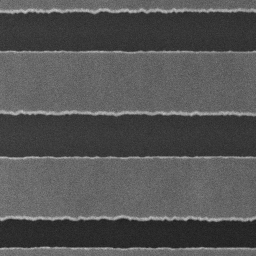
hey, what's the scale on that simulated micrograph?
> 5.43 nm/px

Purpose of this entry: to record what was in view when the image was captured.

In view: lines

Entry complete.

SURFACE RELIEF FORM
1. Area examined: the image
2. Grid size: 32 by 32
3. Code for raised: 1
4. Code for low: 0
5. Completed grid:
11111111111111111111111111111111
11111111000100101010110000000000
00000000000000000000000000000000
00000000000000000000000000000000
00000000000000000000000000000000
00000000000000000000000000000000
11111111111111110111111111101001
11111111111111111111111111111111
11111111111111111111111111111111
11111111111111111111111111111111
11111111111111111111111111111111
11111111111111111111111111111111
11111111111111111111111111111111
11111111111111111111111111111111
00000000000000000000000000000000
00000000000000000000000000000000
00000000000000000000000000000000
00000000000000000000000000000000
00000000000000000000000000000000
00000000000000000000000000000000
11111111111111111111111111111111
11111111111111111111111111111111
11111111111111111111111111111111
11111111111111111111111111111111
11111111111111111111111111111111
11111111111111111111111111111111
11111111111111111111111111111111
10001000010000000110010001111111
00000000000000000000000000000000
00000000000000000000000000000000
00000000000000000000000000000000
11111111111111111111111111111111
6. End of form